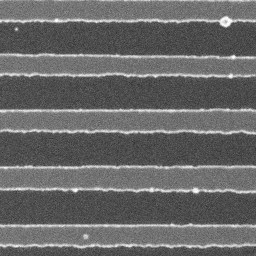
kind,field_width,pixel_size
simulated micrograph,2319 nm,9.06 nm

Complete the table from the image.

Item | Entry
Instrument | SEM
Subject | lines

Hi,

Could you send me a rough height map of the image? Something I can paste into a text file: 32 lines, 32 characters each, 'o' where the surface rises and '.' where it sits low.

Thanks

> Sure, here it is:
oooooooooooooooooooooooooooooooo
oooooooooooooooooooooooooooooooo
oooooooooooooooooooooooooooooooo
................................
................................
................................
................................
oooooooooooooooooooooooooooooooo
oooooooooooooooooooooooooooooooo
............o...oooo....oooooooo
................................
................................
................................
................................
oooooooooooooooooooooooooooooooo
oooooooooooooooooooooooooooooooo
..oo..o.oooo...oooo.ooo.oooooooo
................................
................................
................................
................................
oooooooooooooooooooooooooooooooo
oooooooooooooooooooooooooooooooo
oooooooooooooooooooooooooooooooo
................................
................................
................................
................................
oooooooooooooooooooooooooooooooo
oooooooooooooooooooooooooooooooo
oooooooooooooooooooooooooooooooo
................................